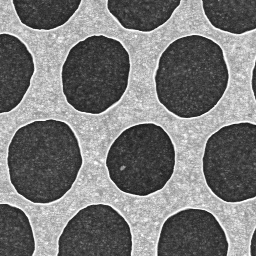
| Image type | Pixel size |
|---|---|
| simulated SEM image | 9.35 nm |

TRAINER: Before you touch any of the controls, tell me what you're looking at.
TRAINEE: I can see holes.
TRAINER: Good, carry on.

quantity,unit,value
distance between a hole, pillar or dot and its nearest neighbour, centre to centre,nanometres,900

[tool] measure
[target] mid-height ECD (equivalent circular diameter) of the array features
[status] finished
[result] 707 nanometres